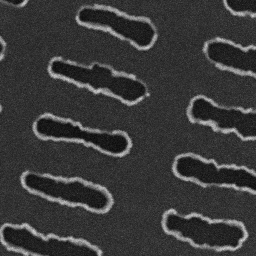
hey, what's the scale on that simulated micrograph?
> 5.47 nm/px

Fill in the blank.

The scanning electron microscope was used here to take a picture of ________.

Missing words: holes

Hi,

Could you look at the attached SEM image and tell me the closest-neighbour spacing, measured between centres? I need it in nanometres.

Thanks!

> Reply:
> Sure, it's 316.